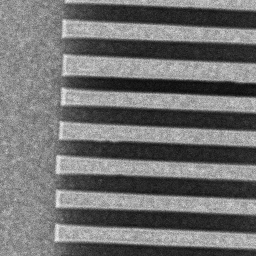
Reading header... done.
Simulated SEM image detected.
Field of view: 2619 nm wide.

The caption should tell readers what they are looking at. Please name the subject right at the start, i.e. parallel lines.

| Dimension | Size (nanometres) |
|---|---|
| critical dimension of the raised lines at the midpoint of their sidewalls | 169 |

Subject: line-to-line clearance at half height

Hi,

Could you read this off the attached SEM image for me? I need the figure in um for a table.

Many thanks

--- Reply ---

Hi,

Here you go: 0.177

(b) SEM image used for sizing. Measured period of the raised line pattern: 348 nm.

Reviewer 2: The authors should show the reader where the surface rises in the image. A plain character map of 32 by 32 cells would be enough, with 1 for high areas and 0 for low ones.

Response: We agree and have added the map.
00000000000011111111111111111111
00000000000000000000000000000000
00000000000000000000000000000000
00000000111111111111111111111000
00000000111111111111111111111111
00000000000000000000000000000011
00000000000000000000000000000000
00000000111111111111100000000000
00000000111111111111111111111111
00000000000111111111111111111111
00000000000000000000000000000000
00000000111111110000000000000000
00000000111111111111111111111111
00000000000000001111111111111111
00000000000000000000000000000000
00000000111110000000000000000000
00000000111111111111111111111111
00000000000111111111111111111111
00000000000000000000000000000000
00000000000000000000000000000000
00000001111111111111111111110000
00000001111111111111111111111111
00000000000000000000000000000111
00000000000000000000000000000000
00000001111111111111111000000000
00000001111111111111111111111111
00000000000000000000000111111111
00000000000000000000000000000000
00000001111111111000000000000000
00000001111111111111111111111111
00000000000000011111111111111111
00000000000000000000000000000000